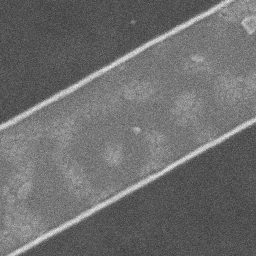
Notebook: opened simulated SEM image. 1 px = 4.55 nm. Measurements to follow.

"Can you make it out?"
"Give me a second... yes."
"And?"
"one or a few lines or trenches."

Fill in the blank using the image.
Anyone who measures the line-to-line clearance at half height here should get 528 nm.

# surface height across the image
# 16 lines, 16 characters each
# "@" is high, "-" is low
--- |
@@@@@@@@@@@@@@--
@@@@@@@@@@@@----
@@@@@@@@@@------
@@@@@@@@--------
@@@@@@----------
@@@@@-----------
@@@-------------
@---------------
--------------@@
------------@@@@
-----------@@@@@
---------@@@@@@@
-------@@@@@@@@@
-----@@@@@@@@@@@
---@@@@@@@@@@@@@
-@@@@@@@@@@@@@@@